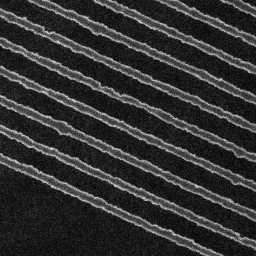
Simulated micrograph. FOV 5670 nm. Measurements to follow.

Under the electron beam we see parallel lines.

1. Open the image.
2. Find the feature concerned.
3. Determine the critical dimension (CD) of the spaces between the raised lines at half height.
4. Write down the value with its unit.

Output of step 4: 18.6 pixels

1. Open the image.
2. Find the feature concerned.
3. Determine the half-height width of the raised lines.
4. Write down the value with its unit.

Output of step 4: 169 nm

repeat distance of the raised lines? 587 nanometers